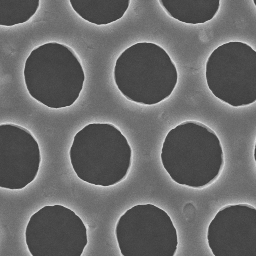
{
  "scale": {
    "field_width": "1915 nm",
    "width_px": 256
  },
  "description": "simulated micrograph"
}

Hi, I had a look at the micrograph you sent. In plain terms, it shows holes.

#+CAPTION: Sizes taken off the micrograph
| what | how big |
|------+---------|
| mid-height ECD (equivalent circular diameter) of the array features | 463 nanometers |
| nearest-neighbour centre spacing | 685 nm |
